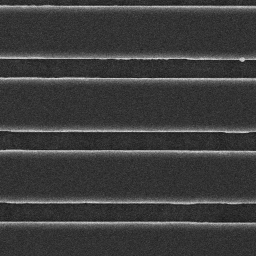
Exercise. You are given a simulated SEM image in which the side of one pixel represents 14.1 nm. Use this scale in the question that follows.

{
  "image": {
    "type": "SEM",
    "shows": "lines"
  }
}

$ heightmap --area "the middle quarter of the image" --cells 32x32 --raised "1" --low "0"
00000000000000000000000000000000
00000000000000000000000000000000
00000000000000000000000000000000
00000000000000000000000000000000
11111111111111111111111111111111
11111111111111111111111111111111
11111111111111111111111111111111
11111111111111111111111111111111
11111111111111111111111111111111
11111111111111111111111111111111
11111111111111111111111111111111
11111111111111111111111111111111
11111111111111111111111111111111
11111111111111111111111111111111
11111111111111111111111111111111
11111111111111111111111111111111
11111111111111111111111111111111
00000000000000000000000000000000
00000000000000000000000000000000
00000000000000000000000000000000
00000000000000000000000000000000
00000000000000000000000000000000
11111111111111111111111111111111
11111111111111111111111111111111
11111111111111111111111111111111
11111111111111111111111111111111
11111111111111111111111111111111
11111111111111111111111111111111
11111111111111111111111111111111
11111111111111111111111111111111
11111111111111111111111111111111
11111111111111111111111111111111